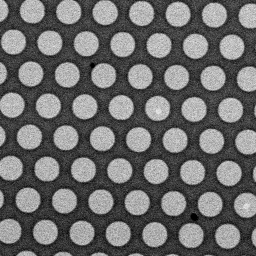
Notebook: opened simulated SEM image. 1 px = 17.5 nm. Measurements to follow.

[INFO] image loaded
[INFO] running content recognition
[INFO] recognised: an array of small figures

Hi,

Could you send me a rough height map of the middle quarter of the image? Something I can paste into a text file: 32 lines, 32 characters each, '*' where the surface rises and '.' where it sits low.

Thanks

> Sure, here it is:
***.....****......**.......**...
****...******...******....****..
****...******...******...******.
****...******...******...******.
***....*****....******...******.
**......***......****.....****..
................................
................................
...****......***......***......*
..******....*****....*****....**
..******...******...******....**
..******...******...******...***
...*****....*****....*****....**
....**.......***......***.....**
................................
................................
***.....****.....***......***...
***....*****....*****....*****..
***....******...******...******.
***....*****....******...******.
***....*****....*****....*****..
........***......***......****..
................................
................................
..*****.....****.....****......*
..******...******...******....**
..******...******...******...***
..******...******...******...***
...****.....****.....*****...***
.............**......***......**
................................
*...............................